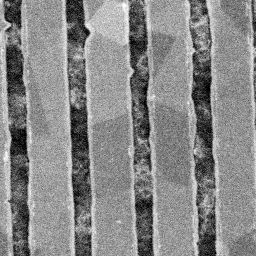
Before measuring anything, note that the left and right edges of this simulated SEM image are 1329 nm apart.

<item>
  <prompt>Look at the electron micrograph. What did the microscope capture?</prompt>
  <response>one or a few lines or trenches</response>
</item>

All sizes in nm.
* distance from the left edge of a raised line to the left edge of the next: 322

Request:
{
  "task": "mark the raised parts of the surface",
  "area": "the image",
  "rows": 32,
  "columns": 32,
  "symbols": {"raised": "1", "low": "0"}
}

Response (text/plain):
00011111001111110011111100111110
00011111000111110011111100111110
10011111000111110011111100111110
10011111000111110001111100111110
10011111000111110001111100011111
10011111000111110001111100011110
10011111000111110001111100111111
10011111000111110001111100111110
10011111000111110001111100111110
10011111000111110001111100111110
10011111000111110001111100111110
10011111000111110001111100111111
10001111100111110011111100111111
10001111100111110001111100111111
10011111100111110001111100011111
10011111100111110001111100011111
10011111100111110001111100011111
10011111100111111001111100011111
10001111100111111001111100011111
10001111100111111001111100011111
10001111100111111001111100011111
10001111100111111001111100011111
10001111100111111001111100011111
10001111100011111001111100011111
10001111100011111001111100011111
10001111100011111001111100011111
10001111100011111001111110011111
10001111100011111001111110011111
10001111100011111001111110011111
10001111100011111001111110011111
10001111100011111001111110011111
11001111100011111001111110011111